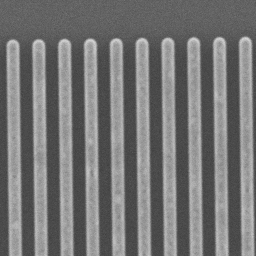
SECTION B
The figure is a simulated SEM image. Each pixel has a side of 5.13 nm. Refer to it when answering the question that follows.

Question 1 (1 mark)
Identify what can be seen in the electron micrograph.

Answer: groups of lines, slits or small figures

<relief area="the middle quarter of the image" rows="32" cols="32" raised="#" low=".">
##...###....##....###....##....#
##...###....##....###....##....#
##...###....##....###....##....#
##...###....##....###....##....#
##...###....##....###....##....#
##...###....##....###....##....#
##...###....###...###....##....#
##...###....###...###....##....#
##....##....###...###....##....#
##....##....###...###....##....#
##....##....###...###....##....#
##....##....###...###....##....#
##....##....###...###....##....#
##....##....###...###....##....#
##....##....###...###....##....#
##....##....###...###....###...#
##....##....###...###....###...#
##....##....###....##....###...#
##....##....###....##....###...#
##....##....###....##....###...#
##....##....###....##....###...#
##....##....###....##....###...#
##....##....###....##....###...#
##....##....###....##....###...#
##....##....###....##....###...#
##....##....###....##....###...#
##....##....###....##....###....
##....##....###....##....###....
##....##....###....##....###....
##....##....###....##....###....
##....##....###....##....###....
##....##....###....##....###....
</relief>